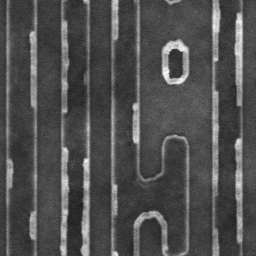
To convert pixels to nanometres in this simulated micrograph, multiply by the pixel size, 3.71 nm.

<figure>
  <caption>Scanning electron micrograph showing parallel lines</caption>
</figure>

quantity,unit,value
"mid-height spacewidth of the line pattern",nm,90.8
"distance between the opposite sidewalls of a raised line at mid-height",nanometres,105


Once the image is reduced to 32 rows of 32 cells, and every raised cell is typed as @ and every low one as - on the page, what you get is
-@@@----@@@---@@@----------@@@--
-@@@@---@@@---@@@----------@@@--
-@@@@---@@@---@@@----------@@@--
-@@@@---@@@---@@@----------@@@--
-@@@@---@@@---@@@----------@@@--
-@@@@---@@@---@@@----@@----@@@--
-@@@@---@@@---@@@---@@@@---@@@--
-@@@@---@@@---@@@---@@@@---@@@--
-@@@@---@@@---@@@---@@@@---@@@--
-@@@@---@@@---@@@---@@@----@@@--
-@@@@---@@@---@@@----------@@@--
-@@@@---@@@---@@@----------@@@--
-@@@@---@@@---@@@----------@@@--
-@@@@---@@@---@@@----------@@@--
-@@@@---@@@---@@@----------@@@--
-@@@@---@@@---@@@----------@@@--
-@@@----@@@---@@@----------@@@--
-@@@----@@@---@@@----@@----@@@--
-@@@----@@@---@@@---@@@@---@@@--
-@@@----@@@---@@@---@@@@---@@@--
-@@@----@@@---@@@---@@@@---@@@--
-@@@@---@@@---@@@---@@@@---@@@--
-@@@@---@@@---@@@@@@@@@@---@@@--
-@@@@---@@@---@@@@@@@@@@---@@@--
-@@@----@@@---@@@@@@@@@@---@@@--
-@@@----@@@---@@@@@@@@@@---@@@--
-@@@----@@@---@@@@@@@@@@---@@@--
-@@@----@@@---@@@@--@@@@---@@@--
-@@@----@@@---@@@---@@@----@@@--
-@@@----@@@---@@@---@@@----@@@--
-@@@----@@@---@@@---@@@----@@@--
-@@@----@@@---@@@---@@@----@@@--